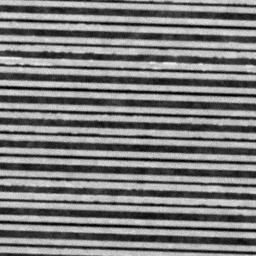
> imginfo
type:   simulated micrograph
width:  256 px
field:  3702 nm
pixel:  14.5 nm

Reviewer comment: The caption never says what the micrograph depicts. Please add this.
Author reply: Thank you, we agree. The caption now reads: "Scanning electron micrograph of parallel lines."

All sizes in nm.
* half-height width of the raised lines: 84.9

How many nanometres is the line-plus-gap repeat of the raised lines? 163